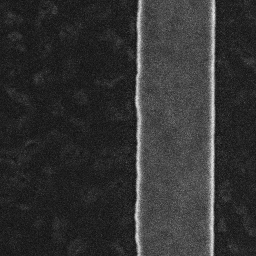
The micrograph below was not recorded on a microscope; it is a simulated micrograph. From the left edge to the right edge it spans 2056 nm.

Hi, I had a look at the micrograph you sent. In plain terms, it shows one or a few lines or trenches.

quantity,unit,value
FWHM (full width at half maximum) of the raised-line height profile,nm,607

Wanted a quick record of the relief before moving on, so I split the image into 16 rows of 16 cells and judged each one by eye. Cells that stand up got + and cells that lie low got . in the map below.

.........++++...
.........++++...
.........++++...
.........++++...
.........++++...
.........++++...
.........++++...
.........++++...
.........++++...
.........++++...
.........++++...
.........++++...
.........++++...
.........++++...
.........++++...
.........++++...